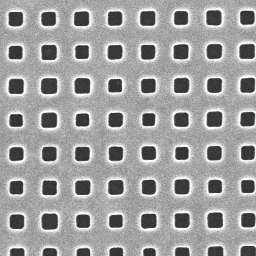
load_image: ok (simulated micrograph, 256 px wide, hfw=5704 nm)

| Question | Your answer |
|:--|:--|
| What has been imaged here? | a regular array of holes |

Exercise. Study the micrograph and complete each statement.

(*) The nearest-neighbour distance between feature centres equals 735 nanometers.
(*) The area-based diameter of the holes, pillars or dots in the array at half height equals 368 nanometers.